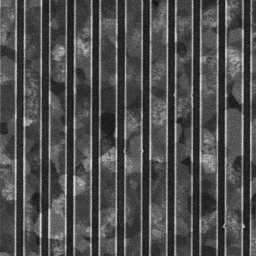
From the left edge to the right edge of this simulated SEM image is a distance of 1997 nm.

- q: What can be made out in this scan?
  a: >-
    parallel lines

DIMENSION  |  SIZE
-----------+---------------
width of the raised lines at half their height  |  0.136 microns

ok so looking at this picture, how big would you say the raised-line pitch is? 197 nanometers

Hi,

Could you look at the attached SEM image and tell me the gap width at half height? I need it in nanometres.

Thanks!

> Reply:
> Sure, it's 61.5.